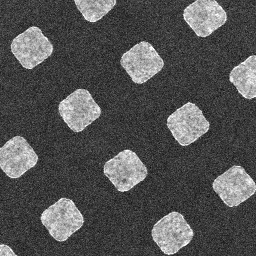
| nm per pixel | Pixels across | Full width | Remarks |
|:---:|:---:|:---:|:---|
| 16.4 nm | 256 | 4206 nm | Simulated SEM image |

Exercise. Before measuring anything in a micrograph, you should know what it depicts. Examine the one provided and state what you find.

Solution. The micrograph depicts raised bodies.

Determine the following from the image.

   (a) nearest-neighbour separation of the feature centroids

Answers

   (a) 1270 nm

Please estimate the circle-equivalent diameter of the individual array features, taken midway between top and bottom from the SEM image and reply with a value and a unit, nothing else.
623 nm